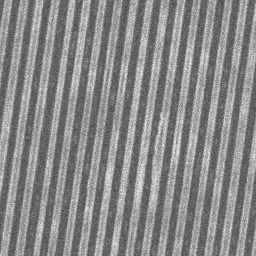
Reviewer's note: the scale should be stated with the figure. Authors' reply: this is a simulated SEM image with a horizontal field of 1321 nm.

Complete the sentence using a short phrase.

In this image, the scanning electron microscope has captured parallel lines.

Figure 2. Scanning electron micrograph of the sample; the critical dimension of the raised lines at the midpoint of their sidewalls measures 0.0338 micrometres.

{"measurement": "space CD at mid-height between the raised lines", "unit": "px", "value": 9.28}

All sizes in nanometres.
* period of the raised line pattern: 80.4